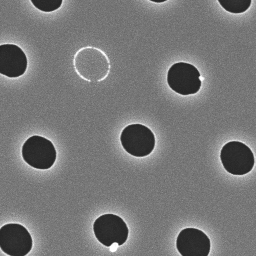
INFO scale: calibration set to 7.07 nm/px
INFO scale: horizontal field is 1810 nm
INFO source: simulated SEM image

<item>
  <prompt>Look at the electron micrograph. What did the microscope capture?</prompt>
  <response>holes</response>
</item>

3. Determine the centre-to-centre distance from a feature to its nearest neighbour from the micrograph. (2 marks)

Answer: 93.7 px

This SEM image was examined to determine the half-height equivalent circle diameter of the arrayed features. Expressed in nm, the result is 238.